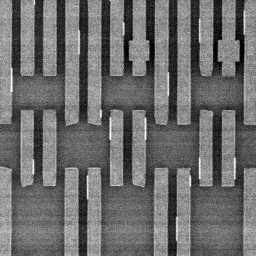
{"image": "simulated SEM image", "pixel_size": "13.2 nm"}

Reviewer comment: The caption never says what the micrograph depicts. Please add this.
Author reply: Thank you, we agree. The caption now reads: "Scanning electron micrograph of wiring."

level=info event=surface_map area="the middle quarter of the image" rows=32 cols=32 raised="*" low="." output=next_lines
.***..***...***..***...***...**.
.***..***...***..***...***...**.
.***..***...***..***...***...**.
.***..***..............***...**.
.***..***..............***...**.
.***..***..............***...**.
.***..***..............***...**.
.***..***..............***..***.
.***..***..............***..***.
.***..***..............***..***.
.***..***..............***..***.
****..***..............***..***.
****..***...**...***...***..***.
****..***...**...***...***..***.
.**...***...**...***...***..***.
............**...***............
............**...***............
............**...***............
............**...***............
............**...***............
............**...***............
............**...***............
............**...***............
............**...***............
............**...***............
............**...***............
***...***...**...***...***..***.
***...***...**...***...***..***.
***...***...**...***...***..***.
***...***...**...***...***..***.
***...***..........*...***..***.
***...***..............***..***.